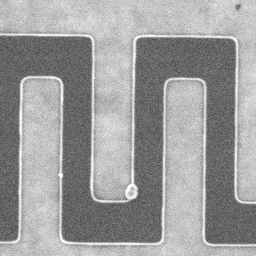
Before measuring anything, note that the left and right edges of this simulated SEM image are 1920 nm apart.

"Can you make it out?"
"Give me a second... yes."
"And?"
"groups of lines, slits or small figures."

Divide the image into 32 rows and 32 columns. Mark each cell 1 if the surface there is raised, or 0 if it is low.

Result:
00000000000000000000000000000000
00000000000000000000000000000000
00000000000000000000000000000000
00000000000000000000000000000000
11111111111000000111111100000000
11111111111100000111111111111100
11111111111100000111111111111100
11111111111100000111111111111100
11111111111100000111111111111100
11111111111100000111111111111100
11100000111100000111100001111100
11100000111100000111100000111100
11100000111100000111100000111100
11100000111100000111100000111100
11100000111100000111100000111000
11100000111100000111100000111000
11100000111100000111100000111000
11100000111100000111100000111000
11100000111100000111100000111000
11100000111100000111100000111000
11100000111100000111100000111000
11100000111100000111100000111000
11100000111100000111100000111000
11100000111100001111100001111000
11100000111100001111100000111100
11100000111111111111100001111111
11100000111111111111000001111111
11000000111111111111000001111111
11000000111111111111000001111111
11000000111111111111000001111111
00000000000000000000000000111111
00000000000000000000000000000000